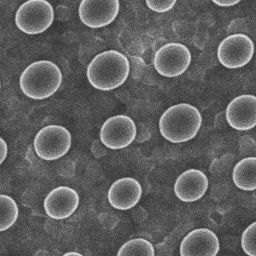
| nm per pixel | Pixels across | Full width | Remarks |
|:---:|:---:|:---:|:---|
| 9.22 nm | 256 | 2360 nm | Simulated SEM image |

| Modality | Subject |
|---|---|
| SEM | a regular array of raised bodies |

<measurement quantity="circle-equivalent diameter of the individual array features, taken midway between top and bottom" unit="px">33.7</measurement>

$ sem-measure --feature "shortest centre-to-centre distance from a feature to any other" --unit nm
576